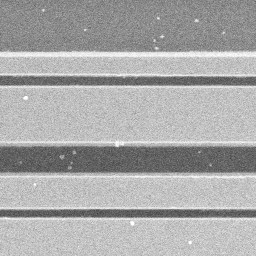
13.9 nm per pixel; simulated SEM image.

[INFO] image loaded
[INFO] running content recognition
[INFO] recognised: lines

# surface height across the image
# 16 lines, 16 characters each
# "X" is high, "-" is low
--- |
----------------
----------------
----------------
XXXXXXXXXXXXXXXX
XXXXXXXXXXXXXXXX
XXXXXXXXXXXXXXXX
XXXXXXXXXXXXXXXX
XXXXXXXXXXXXXXXX
XXXXXXXXXXXXXXXX
----------------
----------------
XXXXXXXXXXXXXXXX
XXXXXXXXXXXXXXXX
XXXXXXXXXXXXXXXX
XXXXXXXXXXXXXXXX
XXXXXXXXXXXXXXXX